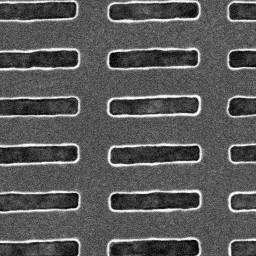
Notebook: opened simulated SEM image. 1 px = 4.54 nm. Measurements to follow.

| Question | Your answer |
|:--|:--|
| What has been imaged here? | holes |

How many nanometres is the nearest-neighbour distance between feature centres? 216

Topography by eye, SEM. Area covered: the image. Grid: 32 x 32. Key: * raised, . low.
.........*****...........****...
..........****...........****...
......********......*********...
********************************
********************************
********************************
*.*.......****...........****...
..........****...........****...
.........******..************.*.
********************************
********************************
********************************
..........****...........****...
..........****...........****...
**************...************.**
********************************
********************************
********************************
..........****...........****...
..........****...........****...
..************.....*************
********************************
********************************
********************************
..........****...........****...
..........****...........****...
********************************
********************************
********************************
********************************
..........****...........****...
..........****...........****...